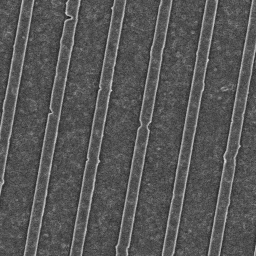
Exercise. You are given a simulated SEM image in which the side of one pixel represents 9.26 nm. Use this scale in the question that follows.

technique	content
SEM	parallel lines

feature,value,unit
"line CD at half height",108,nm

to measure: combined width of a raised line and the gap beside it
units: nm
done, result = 420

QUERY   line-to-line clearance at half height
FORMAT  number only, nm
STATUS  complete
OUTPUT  311